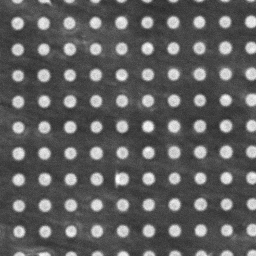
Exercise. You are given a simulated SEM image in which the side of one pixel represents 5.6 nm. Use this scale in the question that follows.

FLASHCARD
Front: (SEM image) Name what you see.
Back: a regular array of raised bodies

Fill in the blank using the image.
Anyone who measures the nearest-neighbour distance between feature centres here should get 144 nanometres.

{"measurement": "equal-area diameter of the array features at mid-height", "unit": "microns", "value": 0.0638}